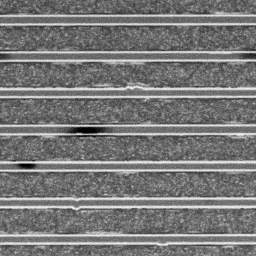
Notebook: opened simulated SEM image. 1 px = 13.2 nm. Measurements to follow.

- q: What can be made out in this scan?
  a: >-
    parallel lines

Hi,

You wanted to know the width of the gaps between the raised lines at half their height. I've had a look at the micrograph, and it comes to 27.8 pixels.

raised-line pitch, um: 0.483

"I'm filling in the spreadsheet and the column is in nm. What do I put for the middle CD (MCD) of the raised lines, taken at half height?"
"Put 114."